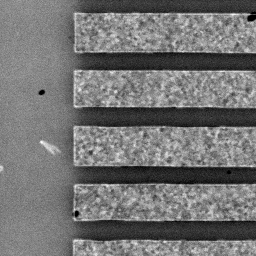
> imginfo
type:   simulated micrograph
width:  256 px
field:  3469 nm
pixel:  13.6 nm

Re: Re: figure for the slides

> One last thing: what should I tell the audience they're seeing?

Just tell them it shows wiring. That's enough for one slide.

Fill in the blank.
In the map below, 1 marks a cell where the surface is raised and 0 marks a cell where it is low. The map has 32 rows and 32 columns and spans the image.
00000000000000000000000000000000
00000000000000000000000000000000
00000000011111111111111111111111
00000000011111111111111111111111
00000000011111111111111111111111
00000000011111111111111111111111
00000000001111000011111111111111
00000000000000000000000000000000
00000000000000000000000000000000
00000000011111111111111111111111
00000000011111111111111111111111
00000000011111111111111111111111
00000000011111111111111111111111
00000000000000000000000000000000
00000000000000000000000000000000
00000000000000000000000000000000
00000000011111111111111111111111
00000000011111111111111111111111
00000000011111111111111111111111
00000000011111111111111111111111
00000000001111111111111111111111
00000000000000000000000000000000
00000000000000000000000000000000
00000000011111111111111111111111
00000000011111111111111111111111
00000000011111111111111111111111
00000000011111111111111111111111
00000000000000000001111111111111
00000000000000000000000000000000
00000000000000000000000000000000
00000000011111111111111111111111
00000000011111111111111111111111